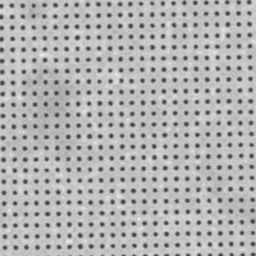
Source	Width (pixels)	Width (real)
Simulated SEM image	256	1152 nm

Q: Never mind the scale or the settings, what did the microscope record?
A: a regular array of holes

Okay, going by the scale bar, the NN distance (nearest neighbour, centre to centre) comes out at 0.0465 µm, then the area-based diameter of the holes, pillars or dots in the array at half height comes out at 4.64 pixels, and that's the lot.